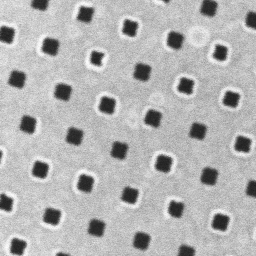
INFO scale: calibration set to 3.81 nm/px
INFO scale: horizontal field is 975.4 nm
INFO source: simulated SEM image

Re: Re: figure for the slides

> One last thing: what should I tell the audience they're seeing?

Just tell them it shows a regular array of holes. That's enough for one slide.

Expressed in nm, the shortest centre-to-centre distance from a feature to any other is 176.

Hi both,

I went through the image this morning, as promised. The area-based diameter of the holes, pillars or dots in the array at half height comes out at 67.1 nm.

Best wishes